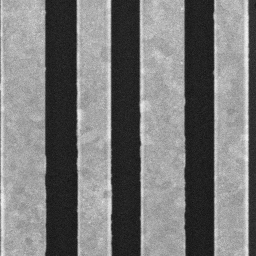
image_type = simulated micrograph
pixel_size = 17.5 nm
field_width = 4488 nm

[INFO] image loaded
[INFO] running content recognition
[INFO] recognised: lines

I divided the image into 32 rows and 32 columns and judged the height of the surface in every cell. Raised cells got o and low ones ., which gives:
oooooo....oooo....ooooo....oooo.
oooooo....oooo....ooooo....oooo.
oooooo....oooo....ooooo....oooo.
oooooo....oooo....ooooo....oooo.
oooooo....oooo....ooooo....oooo.
oooooo....oooo....ooooo....oooo.
oooooo....oooo....ooooo....oooo.
oooooo....oooo....ooooo....oooo.
oooooo....oooo....ooooo....oooo.
oooooo....oooo....ooooo....oooo.
oooooo....oooo....ooooo....oooo.
oooooo....oooo....ooooo....oooo.
oooooo....oooo....ooooo....oooo.
oooooo....oooo....ooooo....oooo.
oooooo....oooo....ooooo....oooo.
oooooo....oooo....ooooo....oooo.
oooooo....oooo....ooooo....oooo.
oooooo....oooo....ooooo....oooo.
oooooo....oooo....ooooo....oooo.
oooooo....oooo....ooooo....oooo.
oooooo....oooo....ooooo....oooo.
oooooo....oooo....ooooo....oooo.
oooooo....oooo....ooooo....oooo.
oooooo....oooo....ooooo....oooo.
oooooo....oooo....ooooo....oooo.
oooooo....oooo....ooooo....oooo.
oooooo....oooo....ooooo....oooo.
oooooo....oooo....ooooo....oooo.
oooooo....oooo....ooooo....oooo.
oooooo....oooo....ooooo....oooo.
oooooo....oooo....ooooo....oooo.
oooooo....oooo....ooooo....oooo.